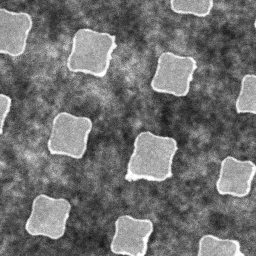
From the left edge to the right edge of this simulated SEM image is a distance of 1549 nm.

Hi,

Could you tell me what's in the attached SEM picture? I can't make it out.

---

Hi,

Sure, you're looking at raised bodies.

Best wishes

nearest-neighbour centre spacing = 516 nanometers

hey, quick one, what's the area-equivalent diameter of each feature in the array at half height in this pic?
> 258 nm